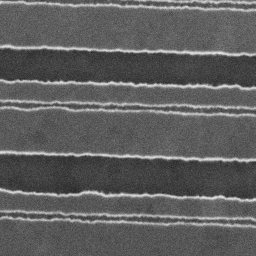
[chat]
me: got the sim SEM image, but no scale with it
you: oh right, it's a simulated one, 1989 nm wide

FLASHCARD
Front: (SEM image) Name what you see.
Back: lines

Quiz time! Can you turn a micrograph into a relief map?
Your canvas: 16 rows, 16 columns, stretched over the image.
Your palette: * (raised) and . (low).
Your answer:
****************
****************
****************
................
................
***************.
****************
****************
****************
****************
................
................
****************
****************
****************
****************